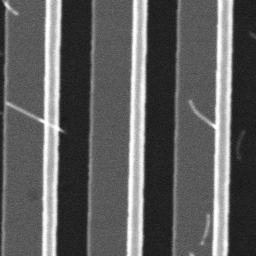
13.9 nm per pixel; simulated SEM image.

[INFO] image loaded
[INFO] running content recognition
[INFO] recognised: lines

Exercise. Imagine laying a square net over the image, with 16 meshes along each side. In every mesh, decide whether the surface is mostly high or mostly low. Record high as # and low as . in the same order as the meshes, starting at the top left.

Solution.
####..###..####.
####..###..###..
####..###..###..
####..###..###..
####..###..###..
####..###..###..
####..###..###..
####..###..###..
####..###..###..
####..###..###..
####..###..###..
####..###..###..
####..###..###..
###...###..###..
###...###..###..
###...###..###..